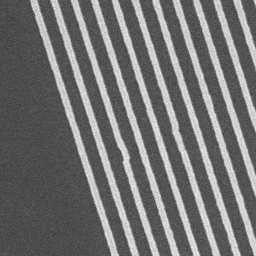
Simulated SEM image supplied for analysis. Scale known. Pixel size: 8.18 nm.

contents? parallel lines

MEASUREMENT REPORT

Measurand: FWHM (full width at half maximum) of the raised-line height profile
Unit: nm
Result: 47.7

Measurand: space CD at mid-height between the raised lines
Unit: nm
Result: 111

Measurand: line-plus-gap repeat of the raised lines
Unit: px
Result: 19.3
